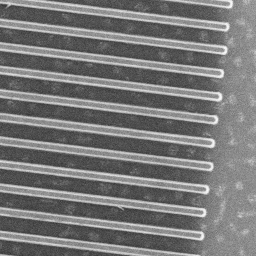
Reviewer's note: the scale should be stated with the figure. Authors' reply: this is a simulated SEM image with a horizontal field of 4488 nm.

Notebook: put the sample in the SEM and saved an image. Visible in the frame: parallel lines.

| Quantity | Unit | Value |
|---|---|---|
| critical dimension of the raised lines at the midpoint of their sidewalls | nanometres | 126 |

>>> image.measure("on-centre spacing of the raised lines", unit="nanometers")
410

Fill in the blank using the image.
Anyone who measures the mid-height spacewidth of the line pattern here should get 283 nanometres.